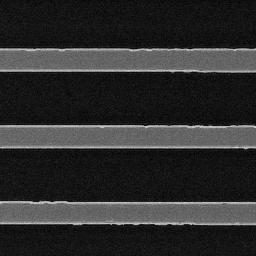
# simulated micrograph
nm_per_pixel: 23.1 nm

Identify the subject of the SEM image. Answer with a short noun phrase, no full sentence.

lines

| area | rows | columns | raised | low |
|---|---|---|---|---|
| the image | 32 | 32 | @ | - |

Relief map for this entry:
--------------------------------
--------------------------------
--------------------------------
--------------------------------
--------------------------------
--------------------------------
@@@@@@@@@@@@@@@@@@@@@@@@@@@@@@@@
@@@@@@@@@@@@@@@@@@@@@@@@@@@@@@@@
@@@@@@@@@@@@@@@@@@@@@@@@@@@@@@@@
--------------------------------
--------------------------------
--------------------------------
--------------------------------
--------------------------------
--------------------------------
--------------------------------
@@@@@@@@@@@@@@@@@@@@@@@@@@@@@@@@
@@@@@@@@@@@@@@@@@@@@@@@@@@@@@@@@
--------------------------------
--------------------------------
--------------------------------
--------------------------------
--------------------------------
--------------------------------
--------------------------------
@@@@@@@@@@@@@@@@@@@@@@@@@@@@@@@@
@@@@@@@@@@@@@@@@@@@@@@@@@@@@@@@@
@@@@@@@@@@@@@@@@@@@@@@@@@@@@@@@@
--------------------------------
--------------------------------
--------------------------------
--------------------------------